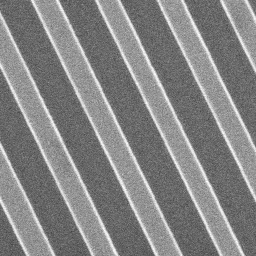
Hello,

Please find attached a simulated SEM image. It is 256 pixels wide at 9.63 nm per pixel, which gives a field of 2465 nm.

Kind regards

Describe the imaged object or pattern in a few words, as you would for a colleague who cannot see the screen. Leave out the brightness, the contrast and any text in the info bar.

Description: lines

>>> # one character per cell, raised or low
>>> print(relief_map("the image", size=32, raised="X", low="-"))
----XXXX----XXX-----XXX-----XXX-
-----XXX-----XXX----XXXX----XXXX
-----XXX-----XXX-----XXX-----XXX
X-----XXX-----XXX----XXXX----XXX
X-----XXX-----XXX-----XXX-----XX
XX-----XXX-----XXX----XXXX----XX
XX-----XXX-----XXX-----XXX-----X
XXX-----XXX-----XXX----XXXX----X
XXX-----XXX-----XXX-----XXX-----
-XXX-----XXX-----XXX----XXX-----
-XXX-----XXX-----XXX-----XXX----
--XXX-----XXX-----XXX----XXX----
--XXX-----XXX-----XXX-----XXX---
---XXX----XXXX----XXXX----XXX---
---XXX-----XXX-----XXX-----XXX--
---XXXX----XXXX-----XXX----XXX--
----XXX-----XXX-----XXX-----XXX-
-----XXX----XXXX----XXX-----XXX-
-----XXX-----XXX-----XXX-----XXX
X----XXXX----XXXX----XXXX----XXX
X-----XXX-----XXX-----XXX-----XX
XX----XXXX----XXXX----XXX-----XX
XX-----XXX-----XXX-----XXX-----X
XXX----XXXX----XXXX----XXX-----X
XXX-----XXX-----XXX-----XXX-----
XXXX----XXXX----XXXX----XXX-----
-XXX-----XXX-----XXX-----XXX----
-XXXX----XXXX----XXXX----XXX----
--XXX-----XXX-----XXX-----XXX---
--XXXX----XXXX----XXXX----XXX---
---XXX-----XXX-----XXX-----XXX--
---XXXX----XXXX----XXXX----XXX--